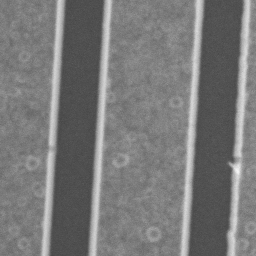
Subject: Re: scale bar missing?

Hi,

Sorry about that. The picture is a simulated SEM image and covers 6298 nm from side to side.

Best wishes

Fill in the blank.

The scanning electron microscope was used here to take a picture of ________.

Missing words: one or a few lines or trenches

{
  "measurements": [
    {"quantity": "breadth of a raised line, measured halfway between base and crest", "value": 2290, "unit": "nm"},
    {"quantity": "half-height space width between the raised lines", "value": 1120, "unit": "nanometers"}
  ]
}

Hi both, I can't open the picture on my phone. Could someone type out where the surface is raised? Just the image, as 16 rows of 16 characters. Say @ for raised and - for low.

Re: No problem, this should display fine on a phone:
@@@@---@@@@@@--@
@@@@---@@@@@---@
@@@@---@@@@@---@
@@@@--@@@@@@---@
@@@@--@@@@@@---@
@@@@--@@@@@@---@
@@@---@@@@@@---@
@@@---@@@@@@---@
@@@---@@@@@@---@
@@@---@@@@@@---@
@@@---@@@@@@---@
@@@---@@@@@@---@
@@@---@@@@@@---@
@@@---@@@@@@---@
@@@---@@@@@@--@@
@@@---@@@@@@--@@